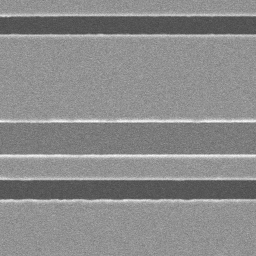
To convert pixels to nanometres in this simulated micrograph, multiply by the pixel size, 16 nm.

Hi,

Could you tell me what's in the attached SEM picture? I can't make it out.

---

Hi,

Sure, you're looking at lines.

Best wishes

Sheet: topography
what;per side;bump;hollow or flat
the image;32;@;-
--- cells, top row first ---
@@@@@@@@@@@@@@@@@@@@@@@@@@@@@@@@
@@@@@@@@@@@@@@@@@@@@@@@@@@@@@@@@
--------------------------------
--------------------------------
@@@@@@@@@@@@@@@@@@@@@@@@@@@@@@@@
@@@@@@@@@@@@@@@@@@@@@@@@@@@@@@@@
@@@@@@@@@@@@@@@@@@@@@@@@@@@@@@@@
@@@@@@@@@@@@@@@@@@@@@@@@@@@@@@@@
@@@@@@@@@@@@@@@@@@@@@@@@@@@@@@@@
@@@@@@@@@@@@@@@@@@@@@@@@@@@@@@@@
@@@@@@@@@@@@@@@@@@@@@@@@@@@@@@@@
@@@@@@@@@@@@@@@@@@@@@@@@@@@@@@@@
@@@@@@@@@@@@@@@@@@@@@@@@@@@@@@@@
@@@@@@@@@@@@@@@@@@@@@@@@@@@@@@@@
@@@@@@@@@@@@@@@@@@@@@@@@@@@@@@@@
--------------------------------
--------------------------------
--------------------------------
--------------------------------
@@@@@@@@@@@@@@@@@@@@@@@@@@@@@@@@
@@@@@@@@@@@@@@@@@@@@@@@@@@@@@@@@
@@@@@@@@@@@@@@@@@@@@@@@@@@@@@@@@
--------------------------------
--------------------------------
--------------------------------
@@@@@@@@@@@@@@@@@@@@@@@@@@@@@@@@
@@@@@@@@@@@@@@@@@@@@@@@@@@@@@@@@
@@@@@@@@@@@@@@@@@@@@@@@@@@@@@@@@
@@@@@@@@@@@@@@@@@@@@@@@@@@@@@@@@
@@@@@@@@@@@@@@@@@@@@@@@@@@@@@@@@
@@@@@@@@@@@@@@@@@@@@@@@@@@@@@@@@
@@@@@@@@@@@@@@@@@@@@@@@@@@@@@@@@